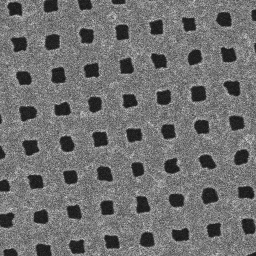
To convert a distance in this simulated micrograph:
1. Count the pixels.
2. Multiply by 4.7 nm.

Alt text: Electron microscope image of a regular array of holes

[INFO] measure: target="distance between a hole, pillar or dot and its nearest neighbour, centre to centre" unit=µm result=0.159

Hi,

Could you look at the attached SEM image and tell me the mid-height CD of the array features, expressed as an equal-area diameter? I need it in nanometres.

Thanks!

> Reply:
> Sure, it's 71.9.